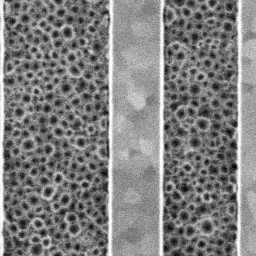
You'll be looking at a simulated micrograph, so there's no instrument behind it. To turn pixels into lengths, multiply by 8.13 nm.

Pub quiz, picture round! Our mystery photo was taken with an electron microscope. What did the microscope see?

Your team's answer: one or a few lines or trenches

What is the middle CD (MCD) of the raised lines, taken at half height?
416 nanometres